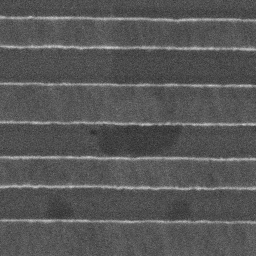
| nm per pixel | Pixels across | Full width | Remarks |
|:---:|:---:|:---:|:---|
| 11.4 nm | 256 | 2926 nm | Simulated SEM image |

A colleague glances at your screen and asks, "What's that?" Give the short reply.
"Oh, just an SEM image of lines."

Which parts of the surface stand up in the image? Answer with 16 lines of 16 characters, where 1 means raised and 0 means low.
0000000000000000
1111111111111111
1111111111111111
0000000000000000
0000000000000000
1111111111111111
1111111111111111
1111111111111111
0000000000000000
0000000000000000
1111111111111111
1111111111111111
0000000000000000
0000000000000000
1111111111111111
1111111111111111